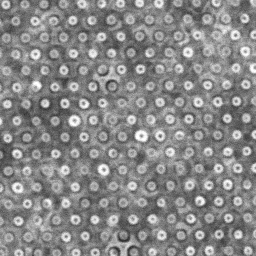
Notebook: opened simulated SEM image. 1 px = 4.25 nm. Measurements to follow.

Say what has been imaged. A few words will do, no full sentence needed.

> a regular array of raised bodies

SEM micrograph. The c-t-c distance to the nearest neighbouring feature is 18.7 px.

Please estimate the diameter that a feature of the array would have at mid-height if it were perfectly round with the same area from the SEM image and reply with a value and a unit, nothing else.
35.5 nanometres